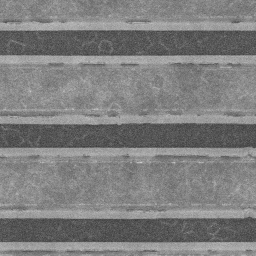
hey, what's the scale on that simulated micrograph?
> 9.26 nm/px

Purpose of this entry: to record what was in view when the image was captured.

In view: one or a few lines or trenches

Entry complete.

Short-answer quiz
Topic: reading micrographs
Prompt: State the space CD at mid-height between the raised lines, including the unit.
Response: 308 nm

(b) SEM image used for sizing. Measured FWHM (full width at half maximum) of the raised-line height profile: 564 nm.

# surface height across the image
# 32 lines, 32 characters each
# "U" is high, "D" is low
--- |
UUUUUUUUUUUUUUUUUUUUUUUUUUUUUUUU
UUUUUUUUUUUUUUUUUUUUUUUUUUUUUUUU
UUUUUUUUUUUUUUUUUUUUUUUUUUUUUUUU
DDDDDDDDDDDDDDDDDDDDDDDDDDDDDDDD
DDDDDDDDDDDDDDDDDDDDDDDDDDDDDDDD
DDDDDDDDDDDDDDDDDDDDDDDDDDDDDDDD
DDDDDDDDDDDDDDDDDDDDDDDDDDDDDDDD
DDDDDDDDDDDDDDDDDDDDDDDDDDDDDDDD
UUUUUUUUUUUUUUUUUUUUUUUUUUUUUUUU
UUUUUUUUUUUUUUUUUUUUUUUUUUUUUUUU
UUUUUUUUUUUUUUUUUUUUUUUUUUUUUUUU
UUUUUUUUUUUUUUUUUUUUUUUUUUUUUUUU
UUUUUUUUUUUUUUUUUUUUUUUUUUUUUUUU
UUUUUUUUUUUUUUUUUUUUUUUUUUUUUUUU
UUUUUUUUUUUUUUUUUUUUUUUUUUUUUUUU
DDDDDDDDDDDDDDDDDDDDDDDDDDDDDDDD
DDDDDDDDDDDDDDDDDDDDDDDDDDDDDDDD
DDDDDDDDDDDDDDDDDDDDDDDDDDDDDDDD
DDDDDDDDDDDDDDDDDDDDDDDDDDDDDDDD
UUUUUUUUUUUUUUUUUUUUUUUUUUUUUUUU
UUUUUUUUUUUUUUUUUUUUUUUUUUUUUUUU
UUUUUUUUUUUUUUUUUUUUUUUUUUUUUUUU
UUUUUUUUUUUUUUUUUUUUUUUUUUUUUUUU
UUUUUUUUUUUUUUUUUUUUUUUUUUUUUUUU
UUUUUUUUUUUUUUUUUUUUUUUUUUUUUUUU
UUUUUUUUUUUUUUUUUUUUUUUUUUUUUUUU
UUUUUUUUUUUUUUUUUUUUUUUUUUUUUUUU
DDDDDDDDDDDDDDDDDDDDDDDDDDDDDDDD
DDDDDDDDDDDDDDDDDDDDDDDDDDDDDDDD
DDDDDDDDDDDDDDDDDDDDDDDDDDDDDDDD
DDDDDDDDDDDDDDDDDDDDDDDDDDDDDDDD
UUUUUUUUUUUUUUUUUUUUUUUUUUUUUUUU